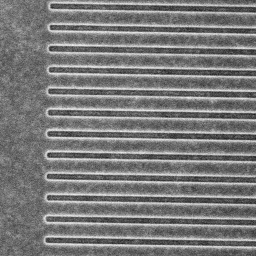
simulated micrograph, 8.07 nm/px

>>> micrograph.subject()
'parallel lines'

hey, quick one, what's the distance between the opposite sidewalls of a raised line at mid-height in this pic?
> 117 nanometres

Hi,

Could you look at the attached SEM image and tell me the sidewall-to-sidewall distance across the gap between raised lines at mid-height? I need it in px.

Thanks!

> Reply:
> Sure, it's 6.26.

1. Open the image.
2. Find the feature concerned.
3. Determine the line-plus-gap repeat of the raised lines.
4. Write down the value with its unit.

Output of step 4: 172 nanometers